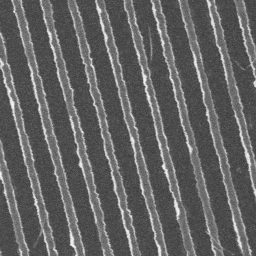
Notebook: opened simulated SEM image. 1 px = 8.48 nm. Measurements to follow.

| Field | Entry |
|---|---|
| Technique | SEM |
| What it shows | parallel lines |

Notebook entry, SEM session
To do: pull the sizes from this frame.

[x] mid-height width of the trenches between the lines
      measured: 0.153 µm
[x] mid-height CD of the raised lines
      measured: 74 nanometres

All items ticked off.